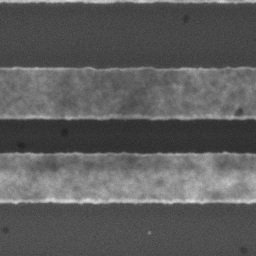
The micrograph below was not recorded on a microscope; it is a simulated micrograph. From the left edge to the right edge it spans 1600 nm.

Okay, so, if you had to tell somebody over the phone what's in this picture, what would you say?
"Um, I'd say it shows lines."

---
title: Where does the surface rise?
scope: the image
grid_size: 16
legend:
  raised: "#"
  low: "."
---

................
................
................
................
################
################
################
................
................
................
################
################
################
................
................
................